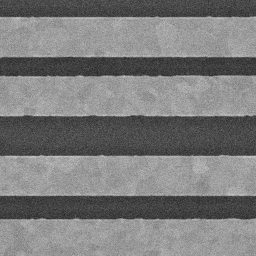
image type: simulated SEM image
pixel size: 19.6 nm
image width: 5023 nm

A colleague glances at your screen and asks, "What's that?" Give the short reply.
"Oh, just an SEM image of lines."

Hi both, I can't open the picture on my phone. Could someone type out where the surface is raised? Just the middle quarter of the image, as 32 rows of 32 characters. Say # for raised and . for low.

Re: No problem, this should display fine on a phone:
................................
................................
................................
################################
################################
################################
################################
################################
################################
################################
################################
################################
################################
................................
................................
................................
................................
................................
................................
................................
................................
................................
................................
################################
################################
################################
################################
################################
################################
################################
################################
################################